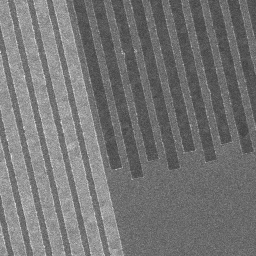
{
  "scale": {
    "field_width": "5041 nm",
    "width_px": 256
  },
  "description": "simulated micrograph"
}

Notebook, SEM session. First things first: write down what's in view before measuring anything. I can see parallel lines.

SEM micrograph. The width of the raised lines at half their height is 12.3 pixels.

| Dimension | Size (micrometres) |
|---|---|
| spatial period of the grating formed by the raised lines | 0.371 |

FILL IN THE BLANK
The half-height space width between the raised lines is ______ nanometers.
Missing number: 127